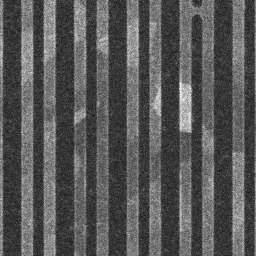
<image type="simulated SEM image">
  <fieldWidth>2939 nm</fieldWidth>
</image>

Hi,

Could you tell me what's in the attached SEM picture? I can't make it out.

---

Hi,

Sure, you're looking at parallel lines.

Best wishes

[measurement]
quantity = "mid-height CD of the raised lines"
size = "129 nanometers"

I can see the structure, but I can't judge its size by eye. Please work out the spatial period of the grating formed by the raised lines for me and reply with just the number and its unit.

302 nm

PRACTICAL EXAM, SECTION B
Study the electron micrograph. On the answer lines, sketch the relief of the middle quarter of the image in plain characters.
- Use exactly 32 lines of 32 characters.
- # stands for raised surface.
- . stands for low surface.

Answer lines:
...##...###.....##....##.....###
...##...###.....##....##.....###
...##...###.....##....##.....###
...##...###.....##....##.....###
...##...###.....##....##.....#..
....#...###.....##....##.....##.
...##...###.....##....##.....###
...##...###.....##....##.....###
...##...###.....##....##.....###
...##...###.....##....##.....###
...##...###.....##....##.....###
...##...###.....##....##.....###
...##...###.....##....##.....###
...##...###.....##....##.....###
...##...###.....##....##.....###
...##...###.....##....##.....###
...##...###.....##....##.....###
...##...###.....##...###.....###
...##...###.....##...###.....###
...##...###.....##....##.....###
...##...###.....##....##.....###
...##...###.....##....##.....###
...##...###.....##....##.....###
...##...###.....##....##.....###
...##...###.....##....##.....###
...##...###.....##....##.....###
...##...###.....##....##.....###
...##...###.....##...###.....###
...##...###.....##...###.....###
...##...###.....##....##.....###
...##...###.....##...###.....###
...##...###.....##...###.....###